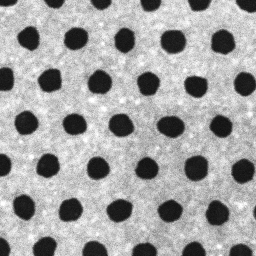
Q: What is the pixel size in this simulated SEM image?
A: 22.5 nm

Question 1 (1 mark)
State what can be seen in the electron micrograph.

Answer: a regular array of holes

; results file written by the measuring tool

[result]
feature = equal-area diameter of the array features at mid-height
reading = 24.3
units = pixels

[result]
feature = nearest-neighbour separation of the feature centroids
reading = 47.4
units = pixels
